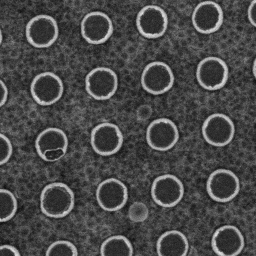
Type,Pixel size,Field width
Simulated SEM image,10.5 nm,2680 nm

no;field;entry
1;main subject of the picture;a regular array of raised bodies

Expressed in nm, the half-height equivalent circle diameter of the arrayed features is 313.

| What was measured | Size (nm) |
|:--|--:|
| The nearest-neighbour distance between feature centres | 578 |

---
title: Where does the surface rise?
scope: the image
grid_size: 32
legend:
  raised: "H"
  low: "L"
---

LLLLLLLLLLLLLLLLLLLLLLLLLHHLLLLL
LLLLLLLLLLLLLLLLLLHHLLLLHHHHLLLH
LLLLHHHLLLLHHHLLLHHHHLLLHHHHLLLH
LLLHHHHLLLHHHHLLLHHHHLLLLHHLLLLL
LLLHHHHLLLHHHHLLLLHHLLLLLLLLLLLL
LLLLHHLLLLLLLLLLLLLLLLLLLLLLLLLL
LLLLLLLLLLLLLLLLLLLLLLLLLLLLLLLL
LLLLLLLLLLLLLLLLLLLLLLLLLLHLLLLL
LLLLLLLLLLLLLLLLLLHHHLLLLHHHLLLL
LLLLLHHLLLLHHHLLLLHHHHLLLHHHLLLL
LLLLHHHHLLLHHHLLLLHHHLLLLHHHLLLL
HLLLHHHHLLLHHHLLLLLHLLLLLLLLLLLL
HLLLLHHLLLLLLLLLLLLLLLLLLLLLLLLL
LLLLLLLLLLLLLLLLLLLLLLLLLLLLLLLL
LLLLLLLLLLLLLLLLLLLLLLLLLLLHLLLL
LLLLLLLLLLLLLLLLLLLHHHLLLLHHHLLL
LLLLLLHHLLLLHHHLLLLHHHLLLHHHHLLL
HLLLLHHHLLLLHHHLLLLHHHLLLLHHHLLL
HLLLLHHHLLLLHHHLLLLHHLLLLLLLLLLL
HLLLLLLLLLLLLLLLLLLLLLLLLLLLLLLL
LLLLLLLLLLLLLLLLLLLLLLLLLLLLLLLL
LLLLLLLLLLLLLLLLLLLLLLLLLLLHHLLL
LLLLLLLLLLLLLLLLLLLLHHLLLLHHHHLL
LLLLLLHHLLLLHHHHLLLHHHHLLLHHHHLL
HHLLLHHHHLLLHHHHLLLHHHHLLLLHHLLL
HHLLLHHHHLLLLHHLLLLLHHLLLLLLLLLL
HHLLLLHHHLLLLLLLLHLLLLLLLLLLLLLL
HLLLLLLLLLLLLLLLLLLLLLLLLLLLLLLL
LLLLLLLLLLLLLLLLLLLLLLLLLLLLHLLL
LLLLLLLLLLLLLLLLLLLLHHHLLLLHHHLL
LLLLLLLHHLLLLHHHLLLLHHHLLLLHHHLL
HHLLLLHHHLLLLHHHLLLLHHHLLLLHHHLL